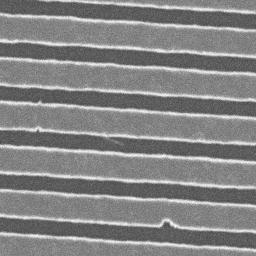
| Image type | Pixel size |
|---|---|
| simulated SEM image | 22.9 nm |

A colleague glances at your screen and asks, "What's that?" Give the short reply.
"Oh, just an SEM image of parallel lines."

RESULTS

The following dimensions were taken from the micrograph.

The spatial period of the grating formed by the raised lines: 1.01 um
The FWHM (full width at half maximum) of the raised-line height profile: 630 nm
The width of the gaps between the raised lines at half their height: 375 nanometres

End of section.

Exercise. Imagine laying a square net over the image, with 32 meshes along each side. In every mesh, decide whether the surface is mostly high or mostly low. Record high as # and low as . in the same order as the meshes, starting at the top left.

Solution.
...............#################
..............................##
###########.....................
###########################.#...
################################
......##########################
....................##.#########
#####...........................
#####################...........
################################
################################
...............#################
.............................###
############....................
###########################.....
################################
.......#########################
......................##########
#####...........................
#####################...........
################################
################################
..............##################
..............................##
##############..................
############################....
################################
.......#########################
......................##########
#####...........................
######################..........
################################